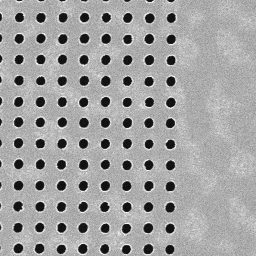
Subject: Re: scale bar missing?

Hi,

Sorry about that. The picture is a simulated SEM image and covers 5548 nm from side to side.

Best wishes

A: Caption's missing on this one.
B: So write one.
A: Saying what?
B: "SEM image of a regular array of holes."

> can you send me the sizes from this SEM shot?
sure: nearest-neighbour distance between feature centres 453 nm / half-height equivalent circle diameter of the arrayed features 208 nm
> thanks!